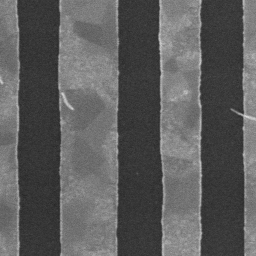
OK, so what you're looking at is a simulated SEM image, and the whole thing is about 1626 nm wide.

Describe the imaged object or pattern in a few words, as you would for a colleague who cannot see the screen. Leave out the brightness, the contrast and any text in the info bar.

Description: lines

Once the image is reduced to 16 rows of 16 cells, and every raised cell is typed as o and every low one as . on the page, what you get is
o...ooo...ooo..o
o...ooo...ooo..o
o...ooo...oo...o
o...ooo...ooo..o
o...ooo...ooo..o
o...ooo...oo...o
o...ooo...ooo..o
o...ooo...ooo..o
o...ooo...ooo..o
o...ooo...oo...o
o...ooo...ooo..o
o...ooo...ooo..o
o...ooo...ooo..o
o...ooo...oo...o
o...ooo...ooo..o
o...ooo...oo...o